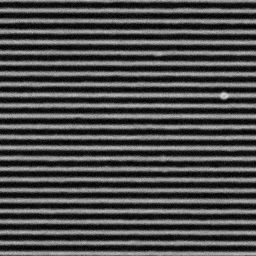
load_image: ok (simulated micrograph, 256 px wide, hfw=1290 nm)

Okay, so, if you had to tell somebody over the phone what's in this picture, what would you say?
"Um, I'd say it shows parallel lines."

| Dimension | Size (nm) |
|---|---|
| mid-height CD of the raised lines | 18.3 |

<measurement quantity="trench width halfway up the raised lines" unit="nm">36.6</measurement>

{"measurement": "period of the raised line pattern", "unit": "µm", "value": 0.0533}